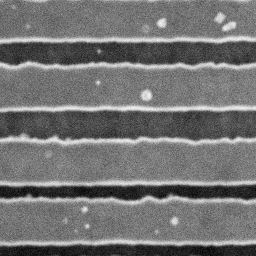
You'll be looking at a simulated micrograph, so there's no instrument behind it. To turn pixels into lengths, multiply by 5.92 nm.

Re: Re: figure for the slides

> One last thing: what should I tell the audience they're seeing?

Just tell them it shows lines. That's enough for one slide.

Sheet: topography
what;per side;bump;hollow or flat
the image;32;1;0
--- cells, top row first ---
11111111111111111111111111111111
11111111111111111111111111111111
11111111111111111111111111111111
11111111111111111111111111111111
11111111111111111111111111111111
00000000000000000000000000000000
00000000000000000000000000000000
00000000000000000000000000000000
11111111111111111111111111111111
11111111111111111111111111111111
11111111111111111111111111111111
11111111111111111111111111111111
11111111111111111111111111111111
11111111111111111111111111111111
00000000000000000000000000000000
00000000000000000000000000000000
00000000000000000000000000000000
11111010001111110111111000011111
11111111111111111111111111111111
11111111111111111111111111111111
11111111111111111111111111111111
11111111111111111111111111111111
11111111111111111111111111111111
00000000000000000000000000000000
00000000000000000000000000000000
11111111111111111111111111111111
11111111111111111111111111111111
11111111111111111111111111111111
11111111111111111111111111111111
11111111111111111111111111111111
11111111100110000000111011111110
00000000000000000000000000000000